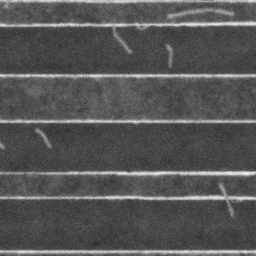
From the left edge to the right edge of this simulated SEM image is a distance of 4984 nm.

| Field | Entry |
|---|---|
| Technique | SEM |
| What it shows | lines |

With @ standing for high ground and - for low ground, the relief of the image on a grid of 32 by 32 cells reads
@@@@@@@@@@@@@@@@@@@@@@@@@@@@@@@@
@@@@@@@@@@@@@@@@@@@@@@@@@@@@@@@@
@@@@@@@@@@@@@@@@@@@@@@@@@@@@@@@@
--------------------------------
--------------------------------
--------------------------------
--------------------------------
--------------------------------
--------------------------------
@@@@@@@@@@@@@@@@@@@@@@@@@@@@@@@@
@@@@@@@@@@@@@@@@@@@@@@@@@@@@@@@@
@@@@@@@@@@@@@@@@@@@@@@@@@@@@@@@@
@@@@@@@@@@@@@@@@@@@@@@@@@@@@@@@@
@@@@@@@@@@@@@@@@@@@@@@@@@@@@@@@@
@@@@@@@@@@@@@@@@@@@@@@@@@@@@@@@@
--------------------------------
--------------------------------
--------------------------------
--------------------------------
--------------------------------
--------------------------------
--------------------------------
@@@@@@@@@@@@@@@@@@@@@@@@@@@@@@@@
@@@@@@@@@@@@@@@@@@@@@@@@@@@@@@@@
@@@@@@@@@@@@@@@@@@@@@@@@@@@@@@@@
--------------------------------
--------------------------------
--------------------------------
--------------------------------
--------------------------------
--------------------------------
@@@@@@@@@@@@@@@@@@@@@@@@@@@@@@@@